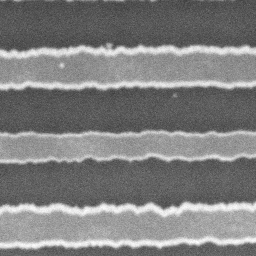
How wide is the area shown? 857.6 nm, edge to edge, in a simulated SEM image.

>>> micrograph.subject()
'lines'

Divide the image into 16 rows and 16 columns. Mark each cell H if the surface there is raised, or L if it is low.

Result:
LLLLLLLLLLLLLLLL
LLLLLLLLLLLLLLLL
LLLLLLLLLLLLLLLL
HHHHHHHHHHHHHHHH
HHHHHHHHHHHHHHHH
HLLLHLHLLLLLLLLL
LLLLLLLLLLLLLLLL
LLLLLLLLLLLLLLLL
HHHHHHHHHHHHHHHH
HHHHHHHHHHHHHHHH
LLLLLLLLLLLLLLLL
LLLLLLLLLLLLLLLL
LLLLLLLLLLLLLLLL
HHHHHHHHHHHHHHHH
HHHHHHHHHHHHHHHH
LLLLLLLLLLLLLLLL